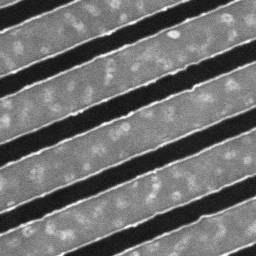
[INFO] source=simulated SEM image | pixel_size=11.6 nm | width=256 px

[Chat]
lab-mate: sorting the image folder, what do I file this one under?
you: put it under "parallel lines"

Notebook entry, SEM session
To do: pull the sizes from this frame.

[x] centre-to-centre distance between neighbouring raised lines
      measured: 0.726 µm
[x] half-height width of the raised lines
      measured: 262 nanometres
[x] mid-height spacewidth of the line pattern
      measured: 471 nanometers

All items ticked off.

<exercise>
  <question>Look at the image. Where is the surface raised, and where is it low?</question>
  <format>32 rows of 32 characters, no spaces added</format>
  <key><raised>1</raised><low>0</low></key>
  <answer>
01111111100000000000001111111000
11111110000000000001111111000000
11110000000000000111111100000000
11000000000000011111110000000000
00000000000011111110000000000000
00000000001111111000000000000011
00000000111111000000000000001111
00000111111100000000000001111111
00011111110000000000000111111100
11111110000000000000111111110000
11111000000000000011111110000000
11000000000000001111111000000000
00000000000001111111100000000000
00000000000111111100000000000001
00000000111111110000000000000111
00000011111110000000000000011111
00001111111000000000000011111110
01111111100000000000001111111000
11111100000000000001111111000000
11110000000000000111111100000000
10000000000000011111110000000000
00000000000011111110000000000000
00000000001111111000000000000011
00000001111111000000000000001111
00000111111100000000000001111111
00111111110000000000000111111100
11111110000000000000111111110000
11111000000000000011111110000000
11000000000000011111111000000000
00000000000001111111100000000000
00000000000111111100000000000001
00000000111111110000000000000111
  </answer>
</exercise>